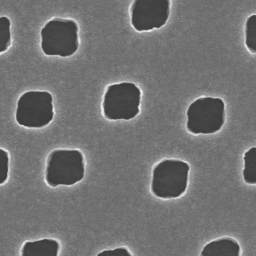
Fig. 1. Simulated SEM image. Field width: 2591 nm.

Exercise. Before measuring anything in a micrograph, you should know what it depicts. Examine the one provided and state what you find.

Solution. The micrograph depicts holes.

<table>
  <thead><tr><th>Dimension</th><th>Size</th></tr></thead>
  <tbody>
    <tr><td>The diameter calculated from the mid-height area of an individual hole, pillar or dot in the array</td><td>38.3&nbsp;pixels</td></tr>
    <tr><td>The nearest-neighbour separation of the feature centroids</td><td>72.5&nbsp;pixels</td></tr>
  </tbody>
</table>